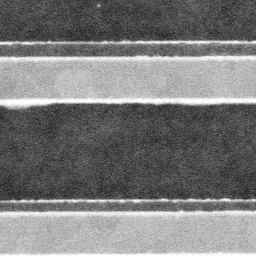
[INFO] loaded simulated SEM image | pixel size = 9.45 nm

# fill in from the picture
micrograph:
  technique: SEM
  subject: lines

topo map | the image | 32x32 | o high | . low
................................
................................
................................
................................
................................
oooooooooooooooooooooooooooooooo
oooooooooooooooooooooooooooooooo
oooooooooooooooooooooooooooooooo
oooooooooooooooooooooooooooooooo
oooooooooooooooooooooooooooooooo
oooooooooooooooooooooooooooooooo
oooooooooooooooooooooooooooooooo
ooo.oo..........................
................................
................................
................................
................................
................................
................................
................................
................................
................................
................................
................................
................................
oooooooooooooooooooooooooooooooo
oooooooooooooooooooooooooooooooo
oooooooooooooooooooooooooooooooo
oooooooooooooooooooooooooooooooo
oooooooooooooooooooooooooooooooo
oooooooooooooooooooooooooooooooo
oooooooooooooooooooooooooooooooo